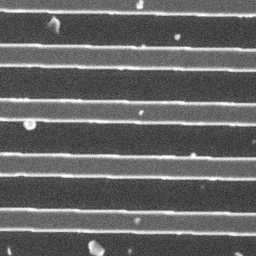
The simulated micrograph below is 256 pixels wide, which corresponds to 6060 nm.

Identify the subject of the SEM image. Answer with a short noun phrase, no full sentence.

lines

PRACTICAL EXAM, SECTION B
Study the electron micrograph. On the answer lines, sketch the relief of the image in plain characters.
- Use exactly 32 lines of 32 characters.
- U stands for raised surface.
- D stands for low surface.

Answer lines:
UUUUUUUUUUUUUUUUUUUUUUUUUUUUUUUU
DDDDDDUUUUUUUUUUUUUUUUUUUUUUUUUU
DDDDDDDDDDDDDDDDDDDDDDDDDDDDDDDD
DDDDDDDDDDDDDDDDDDDDDDDDDDDDDDDD
DDDDDDDDDDDDDDDDDDDDDDDDDDDDDDDD
DDDDDDDDDDDDDDDDDDDDDDDDDDDDDDDD
UUUUUUUUUUUUUUUUUUUUUUUUUUUUUUUU
UUUUUUUUUUUUUUUUUUUUUUUUUUUUUUUU
DDDDDDDDDDDDDDUUUUUUUUUUUUUUUUUU
DDDDDDDDDDDDDDDDDDDDDDDDDDDDDDDD
DDDDDDDDDDDDDDDDDDDDDDDDDDDDDDDD
DDDDDDDDDDDDDDDDDDDDDDDDDDDDDDDD
UUUUDDDDDDDDDDDDDDDDDDDDDDDDDDDD
UUUUUUUUUUUUUUUUUUUUUUUUUUUUUUUU
UUUUUUUUUUUUUUUUUUUUUUUUUUUUUUUU
DDDDDDDDDDDDDDDDDDDDDDUUUUUUUUUU
DDDDDDDDDDDDDDDDDDDDDDDDDDDDDDDD
DDDDDDDDDDDDDDDDDDDDDDDDDDDDDDDD
DDDDDDDDDDDDDDDDDDDDDDDDDDDDDDDD
UUUUUUUUUUUUUUUDDDDDDDDDDDDDDDDD
UUUUUUUUUUUUUUUUUUUUUUUUUUUUUUUU
UUUUUUUUUUUUUUUUUUUUUUUUUUUUUUUU
DDDDDDDDDDDDDDDDDDDDDDDDDDDDDDDD
DDDDDDDDDDDDDDDDDDDDDDDDDDDDDDDD
DDDDDDDDDDDDDDDDDDDDDDDDDDDDDDDD
DDDDDDDDDDDDDDDDDDDDDDDDDDDDDDDD
UUUUUUUUUUUUUUUUDDDDDDDDDDDDDDDD
UUUUUUUUUUUUUUUUUUUUUUUUUUUUUUUU
UUUUUUUUUUUUUUUUUUUUUUUUUUUUUUUU
DDDDDDDDDDDDDDDDDDDDDDDDDDDDDDDD
DDDDDDDDDDDDDDDDDDDDDDDDDDDDDDDD
DDDDDDDDDDDDDDDDDDDDDDDDDDDDDDDD